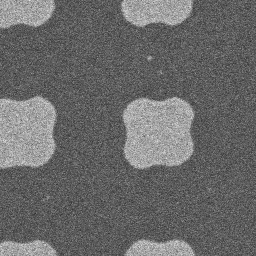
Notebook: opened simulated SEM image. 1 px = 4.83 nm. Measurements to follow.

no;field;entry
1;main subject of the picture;raised bodies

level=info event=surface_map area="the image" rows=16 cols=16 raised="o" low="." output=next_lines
ooo.....oooo....
o...............
................
................
................
................
ooo.....oooo....
ooo.....oooo....
ooo.....oooo....
ooo.....oooo....
................
................
................
................
................
ooo.....oooo....